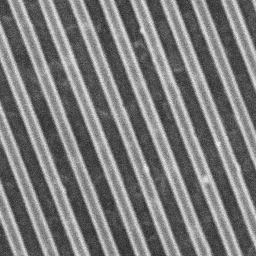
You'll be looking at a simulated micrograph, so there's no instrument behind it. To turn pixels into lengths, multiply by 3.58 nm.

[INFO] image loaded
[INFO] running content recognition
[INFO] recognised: parallel lines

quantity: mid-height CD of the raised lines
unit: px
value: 12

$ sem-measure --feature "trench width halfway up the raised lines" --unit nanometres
59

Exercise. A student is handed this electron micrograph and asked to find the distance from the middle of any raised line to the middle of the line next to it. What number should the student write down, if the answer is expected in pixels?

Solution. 28.5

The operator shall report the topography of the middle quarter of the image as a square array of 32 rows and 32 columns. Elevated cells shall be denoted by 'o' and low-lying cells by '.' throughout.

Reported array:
ooo.....ooo....ooo.....ooo.....o
oooo....ooo.....ooo....oooo....o
.ooo....oooo....ooo.....ooo....o
.ooo.....ooo....oooo....ooo.....
..ooo....ooo.....ooo....oooo....
..ooo.....ooo....ooo.....ooo....
..oooo....ooo.....ooo....ooo....
...ooo.....ooo....ooo.....ooo...
...ooo.....ooo....oooo....ooo...
....ooo....ooo.....ooo....oooo..
....ooo.....ooo....ooo.....ooo..
....ooo.....ooo.....ooo....ooo..
.....ooo....oooo....ooo.....ooo.
o....ooo.....ooo....ooo.....ooo.
o....oooo....ooo.....ooo....ooo.
o.....ooo.....ooo....ooo.....ooo
oo....ooo.....ooo....oooo....ooo
oo.....ooo....oooo....ooo....ooo
oo.....ooo.....ooo....ooo.....oo
ooo....ooo.....ooo.....ooo....oo
ooo.....ooo.....ooo....ooo.....o
oooo....ooo.....ooo....oooo....o
.ooo....oooo....oooo....ooo....o
.ooo.....ooo.....ooo....ooo.....
..ooo....ooo.....ooo....oooo....
..ooo.....ooo....oooo....ooo....
...ooo....ooo.....ooo....ooo....
...ooo....oooo....ooo.....ooo...
...ooo.....ooo.....ooo....ooo...
...oooo....oooo....ooo.....ooo..
....ooo.....ooo....ooo.....ooo..
....ooo.....ooo.....ooo....ooo..